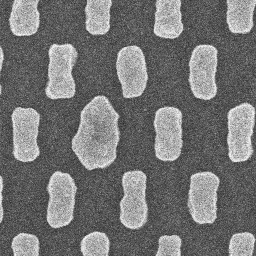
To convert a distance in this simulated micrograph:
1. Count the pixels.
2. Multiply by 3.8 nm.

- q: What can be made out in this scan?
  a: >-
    a regular array of raised bodies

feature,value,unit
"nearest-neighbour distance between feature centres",0.269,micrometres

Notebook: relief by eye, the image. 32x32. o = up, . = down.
..ooo......ooo......ooo.....oooo
..ooo......ooo......ooo.....oooo
.oooo......ooo.....oooo.....oooo
..ooo......ooo.....oooo......oo.
....................oo..........
................................
......ooo......ooo......ooo.....
......ooo......ooo......ooo.....
......ooo......ooo......ooo.....
......ooo......ooo......ooo.....
......ooo......ooo......ooo.....
......ooo......ooo......ooo.....
............o...................
..o........ooo...............oo.
..ooo.....ooooo....oooo......ooo
..ooo.....ooooo....oooo......oo.
..ooo.....ooooo....oooo......oo.
..ooo....oooooo....oooo......oo.
..ooo....ooooo.....oooo......oo.
..ooo.....oooo......oo.......oo.
..........ooo...................
................o...............
......ooo......ooo......ooo.....
......ooo......ooo......ooo.....
......ooo.......oo......ooo.....
......ooo......ooo......ooo.....
......ooo......ooo......ooo.....
......ooo......ooo......ooo.....
................................
..oo.......oo................ooo
.oooo.....oooo......oo.......ooo
..ooo.....ooo.......oo.......ooo